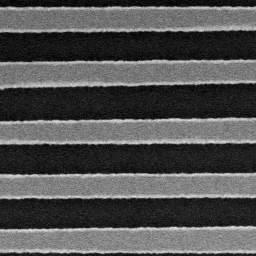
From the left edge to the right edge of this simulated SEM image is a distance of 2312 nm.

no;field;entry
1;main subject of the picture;lines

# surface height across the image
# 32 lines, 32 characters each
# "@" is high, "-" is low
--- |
--------------------------------
@@@@@@@@@@@@@@@@@@@@@@@@@@@@@@@@
@@@@@@@@@@@@@@@@@@@@@@@@@@@@@@@@
@@@@@@@@@@@@@@@@@@@@@@@@@@@@@@@@
--------------------------------
--------------------------------
--------------------------------
--------------------------------
@@@@@@@@@@@@@@@@@@@@@@@@@@@@@@@@
@@@@@@@@@@@@@@@@@@@@@@@@@@@@@@@@
@@@@@@@@@@@@@@@@@@@-@@----------
--------------------------------
--------------------------------
--------------------------------
--------------------------------
@@@@@@@@@@@@@@@@@@@@@@@@@@@@@@@@
@@@@@@@@@@@@@@@@@@@@@@@@@@@@@@@@
@@@@@@@@@@@@@@@@@@@@@@@@@@@@@@@@
--------------------------------
--------------------------------
--------------------------------
--------------------------------
@@@@@@@@@@@@@@@@@@@@@@@@@@@@@@@@
@@@@@@@@@@@@@@@@@@@@@@@@@@@@@@@@
@@@@@@@@@@@@@@@@@@@@@@@@@@@@@@@@
--------------------------------
--------------------------------
--------------------------------
----------------------------@@@@
@@@@@@@@@@@@@@@@@@@@@@@@@@@@@@@@
@@@@@@@@@@@@@@@@@@@@@@@@@@@@@@@@
-----@-@@-@@@@@@@@@@@-@@@@@@@@@@